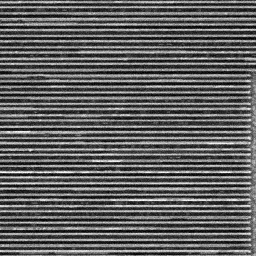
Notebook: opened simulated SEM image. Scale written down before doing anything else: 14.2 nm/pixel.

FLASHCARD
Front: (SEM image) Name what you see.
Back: parallel lines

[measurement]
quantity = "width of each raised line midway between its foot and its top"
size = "26.7 nm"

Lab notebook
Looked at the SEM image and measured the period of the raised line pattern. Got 80.7 nm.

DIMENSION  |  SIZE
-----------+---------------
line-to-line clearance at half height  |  53.3 nanometers